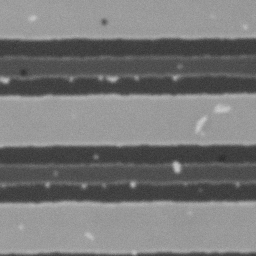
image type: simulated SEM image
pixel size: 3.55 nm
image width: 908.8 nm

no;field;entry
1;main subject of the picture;lines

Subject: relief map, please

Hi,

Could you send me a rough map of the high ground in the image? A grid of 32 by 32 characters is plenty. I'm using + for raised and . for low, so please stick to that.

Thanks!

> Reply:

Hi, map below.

++++++++++++++++++++++++++++++++
++++++++++++++++++++++++++++++++
++++++++++++++++++++++++++++++++
++++++++++++++++++++++++++++++++
++++++++++++++++++++++++++++++++
................................
................................
++++++++++++++++++++++++++++++++
++++++++++++++++++++++++++++++++
+++++++++++++++++++++++.......++
................................
................................
++++++++++++++++++++++++++++++++
++++++++++++++++++++++++++++++++
++++++++++++++++++++++++++++++++
++++++++++++++++++++++++++++++++
++++++++++++++++++++++++++++++++
++++++++++++++++++++++++++++++++
................................
................................
..............+......+..+.++..++
++++++++++++++++++++++++++++++++
++++++++++++++++++++++++++++++++
................................
................................
++++++++++++++++++++++++++++++++
++++++++++++++++++++++++++++++++
++++++++++++++++++++++++++++++++
++++++++++++++++++++++++++++++++
++++++++++++++++++++++++++++++++
++++++++++++++++++++++++++++++++
++++++++++++++++++++.+++.+++..++